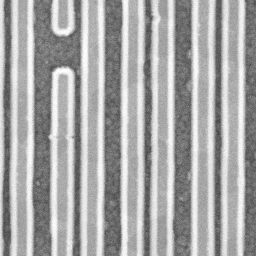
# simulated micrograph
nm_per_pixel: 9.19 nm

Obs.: parallel lines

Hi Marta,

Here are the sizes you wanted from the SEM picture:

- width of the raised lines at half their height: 146 nm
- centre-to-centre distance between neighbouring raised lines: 35.1 pixels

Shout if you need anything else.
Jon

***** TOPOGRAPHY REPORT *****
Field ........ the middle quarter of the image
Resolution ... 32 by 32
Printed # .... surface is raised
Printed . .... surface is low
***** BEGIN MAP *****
.....####......####....####.....
.....####......####....####.....
##...####......####....####.....
##...####......####....####.....
##...####......####....####.....
##...####......####....####.....
##...####......####....####.....
##...####......####....####.....
##...####......####....####.....
##...####......####....####.....
##...####......####....###......
##...####......####....###......
#....####......####....###......
#....####......####....###......
#....####......####....###......
#....####......####....###......
#....####......####....###......
#....####......####....###......
#....####......####....###......
#....####......####....###......
#....####......####....###......
#....####......####....###......
#....####......####....###......
#....####......####....###......
#....####......####....####.....
#....####......####....####.....
#....####......####....####.....
#....####......####....####.....
#....####......####....####.....
#....####......####....###......
#....####......####....###......
#....####......####....###......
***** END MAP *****